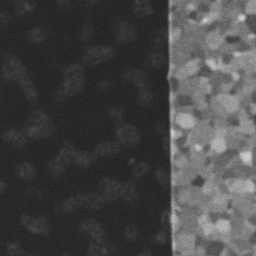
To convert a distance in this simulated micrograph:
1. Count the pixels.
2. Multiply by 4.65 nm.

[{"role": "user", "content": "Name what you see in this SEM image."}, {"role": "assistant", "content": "one or a few lines or trenches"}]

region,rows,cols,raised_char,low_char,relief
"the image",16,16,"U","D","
DDDDDDDDDDDUUUUU
DDDDDDDDDDDUUUUU
DDDDDDDDDDDUUUUU
DDDDDDDDDDDUUUUU
DDDDDDDDDDDUUUUU
DDDDDDDDDDDUUUUU
DDDDDDDDDDDUUUUU
DDDDDDDDDDDUUUUU
DDDDDDDDDDDUUUUU
DDDDDDDDDDDUUUUU
DDDDDDDDDDDUUUUU
DDDDDDDDDDDUUUUU
DDDDDDDDDDDUUUUU
DDDDDDDDDDDUUUUU
DDDDDDDDDDDUUUUU
DDDDDDDDDDDUUUUU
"